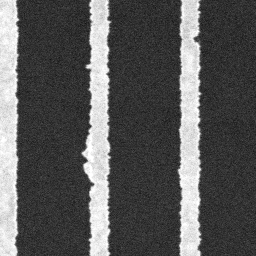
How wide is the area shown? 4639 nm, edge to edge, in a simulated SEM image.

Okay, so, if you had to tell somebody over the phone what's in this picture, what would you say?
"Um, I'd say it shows one or a few lines or trenches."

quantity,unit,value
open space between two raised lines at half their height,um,1.35